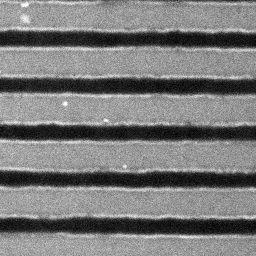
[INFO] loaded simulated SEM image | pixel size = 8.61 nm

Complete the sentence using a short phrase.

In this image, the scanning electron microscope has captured lines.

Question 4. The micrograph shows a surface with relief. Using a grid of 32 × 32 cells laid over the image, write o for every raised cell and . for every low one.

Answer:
................................
................................
................................
................................
oooooooooooooooooooooooooooooooo
oooooooooooooooooooooooooooooooo
................................
................................
................................
................................
oooooooooooooooooooooooooooooooo
oooooooooooooooooooooooooooooooo
................................
................................
................................
oooooooooooo.oooo..oo.........o.
oooooooooooooooooooooooooooooooo
oooooooooooooooooooooooooooooooo
................................
................................
................................
oooooooooooooooooooooooooooooooo
oooooooooooooooooooooooooooooooo
ooo...oooooooooooooooooooooooooo
................................
................................
................................
oooooooooooooooooooooooooooooooo
oooooooooooooooooooooooooooooooo
.................ooooooooooooooo
................................
................................